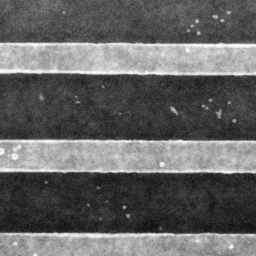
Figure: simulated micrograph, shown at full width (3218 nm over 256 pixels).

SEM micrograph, lines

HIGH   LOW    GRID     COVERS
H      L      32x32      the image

LLLLLLLLLLLLLLLLLLLLLLLLLLLLLLLL
LLLLLLLLLLLLLLLLLLLLLLLLLLLLLLLL
LLLLLLLLLLLLLLLLLLLLLLLLLLLLLLLL
LLLLLLLLLLLLLLLLLLLLLLLLLLLLLLLL
LLLLLLLLLLLLLLLLLLLLLLLLLLLLLLLL
HHHHHHHHHHHHHHHHHLLLLLLLLLLLLLLL
HHHHHHHHHHHHHHHHHHHHHHHHHHHHHHHH
HHHHHHHHHHHHHHHHHHHHHHHHHHHHHHHH
HHHHHHHHHHHHHHHHHHHHHHHHHHHHHHHH
LLLLLLLLLLLLLLLLLLLLLLLLLLLLLLLL
LLLLLLLLLLLLLLLLLLLLLLLLLLLLLLLL
LLLLLLLLLLLLLLLLLLLLLLLLLLLLLLLL
LLLLLLLLLLLLLLLLLLLLLLLLLLLLLLLL
LLLLLLLLLLLLLLLLLLLLLLLLLLLLLLLL
LLLLLLLLLLLLLLLLLLLLLLLLLLLLLLLL
LLLLLLLLLLLLLLLLLLLLLLLLLLLLLLLL
LLLLLLLLLLLLLLLLLLLLLLLLLLLLLLLL
LLLLLLLLLLLLLLLLLLLLLLLLLLLLLLLL
HHHHHHHHHHHHHHHHHHHHHHHHHHHHHHHH
HHHHHHHHHHHHHHHHHHHHHHHHHHHHHHHH
HHHHHHHHHHHHHHHHHHHHHHHHHHHHHHHH
LLLLLLLHLLLHHHHHHHHHHHHHHHHHHHHH
LLLLLLLLLLLLLLLLLLLLLLLLLLLLLLLL
LLLLLLLLLLLLLLLLLLLLLLLLLLLLLLLL
LLLLLLLLLLLLLLLLLLLLLLLLLLLLLLLL
LLLLLLLLLLLLLLLLLLLLLLLLLLLLLLLL
LLLLLLLLLLLLLLLLLLLLLLLLLLLLLLLL
LLLLLLLLLLLLLLLLLLLLLLLLLLLLLLLL
LLLLLLLLLLLLLLLLLLLLLLLLLLLLLLLL
HHHHHHHHHHHHHHHHHHHHHHHHHHHHHHHH
HHHHHHHHHHHHHHHHHHHHHHHHHHHHHHHH
HHHHHHHHHHHHHHHHHHHHHHHHHHHHHHHH